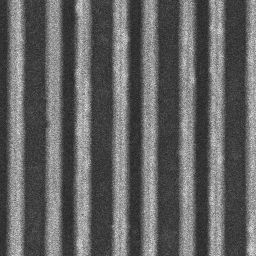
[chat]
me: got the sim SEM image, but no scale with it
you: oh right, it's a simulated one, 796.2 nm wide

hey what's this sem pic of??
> parallel lines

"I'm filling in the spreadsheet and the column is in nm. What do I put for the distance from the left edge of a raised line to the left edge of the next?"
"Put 104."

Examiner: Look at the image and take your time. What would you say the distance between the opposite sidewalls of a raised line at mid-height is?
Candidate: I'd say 41.2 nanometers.